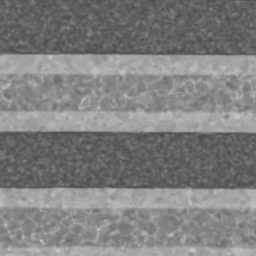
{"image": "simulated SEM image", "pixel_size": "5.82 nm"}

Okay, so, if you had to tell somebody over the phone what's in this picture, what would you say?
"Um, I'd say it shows one or a few lines or trenches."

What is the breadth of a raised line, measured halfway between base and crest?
0.338 um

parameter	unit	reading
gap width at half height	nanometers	441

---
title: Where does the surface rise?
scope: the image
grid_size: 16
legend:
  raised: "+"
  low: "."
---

................
................
................
................
++++++++++++++++
++++++++++++++++
++++++++++++++++
++++++++++++++++
................
................
................
................
++++++++++++++++
++++++++++++++++
++++++++++++++++
++++++++++++++++